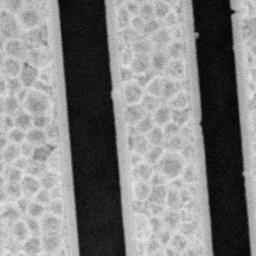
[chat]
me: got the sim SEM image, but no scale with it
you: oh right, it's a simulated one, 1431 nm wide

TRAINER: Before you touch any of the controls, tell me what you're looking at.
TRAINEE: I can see one or a few lines or trenches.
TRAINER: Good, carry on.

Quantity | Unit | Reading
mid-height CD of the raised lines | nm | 424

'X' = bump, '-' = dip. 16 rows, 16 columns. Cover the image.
XXX----XXXXX---X
XXX----XXXXX---X
XXX----XXXXX---X
XXXX---XXXXX---X
XXXX---XXXXX---X
XXXX---XXXXX---X
XXXX---XXXXX---X
XXXX----XXXX---X
XXXX----XXXX---X
XXXX----XXXX----
XXXX----XXXX----
XXXX----XXXXX---
XXXX----XXXXX---
XXXX----XXXXX---
XXXX----XXXXX---
XXXXX---XXXXX---